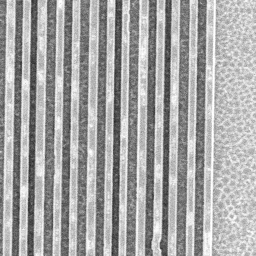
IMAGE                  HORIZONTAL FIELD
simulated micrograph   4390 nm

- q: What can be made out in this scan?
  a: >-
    parallel lines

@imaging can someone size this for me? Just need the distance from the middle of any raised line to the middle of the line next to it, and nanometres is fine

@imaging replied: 286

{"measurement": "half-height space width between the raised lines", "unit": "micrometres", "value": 0.159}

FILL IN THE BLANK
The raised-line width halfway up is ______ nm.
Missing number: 129